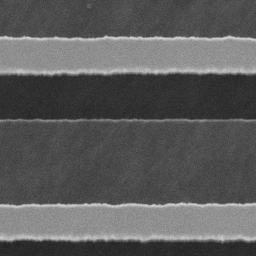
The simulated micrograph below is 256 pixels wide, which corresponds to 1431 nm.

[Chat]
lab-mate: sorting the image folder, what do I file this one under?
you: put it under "lines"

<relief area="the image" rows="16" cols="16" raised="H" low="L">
HHHHHHHHHHHHHHHH
HHHHHHHHHHHHHHHH
HHHHHHHHHHHHHHHH
HHHHHHHHHHHHHHHH
HHHHHHHHHHHHHHHH
LLLLLLLLLLLLLLLL
LLLLLLLLLLLLLLLL
LLLLLLLLLLLLLLLL
HHHHHHHHHHHHHHHH
HHHHHHHHHHHHHHHH
HHHHHHHHHHHHHHHH
HHHHHHHHHHHHHHHH
HHHHHHHHHHHHHHHH
HHHHHHHHHHHHHHHH
HHHHHHHHHHHHHHHH
LLLLLLLLLLLLLLLL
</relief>